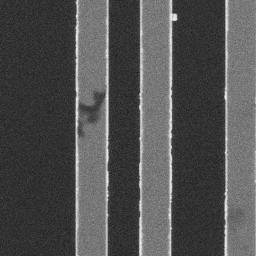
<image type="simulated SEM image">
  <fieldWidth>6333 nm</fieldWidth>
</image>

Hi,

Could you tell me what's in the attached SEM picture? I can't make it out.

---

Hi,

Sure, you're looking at lines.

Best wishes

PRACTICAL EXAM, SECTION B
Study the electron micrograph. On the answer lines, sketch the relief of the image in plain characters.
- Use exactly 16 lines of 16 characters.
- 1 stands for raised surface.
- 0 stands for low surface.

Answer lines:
0000011001100011
0000011001100011
0000011001100011
0000011001100011
0000011001100011
0000011001100011
0000011001100011
0000011001100011
0000011001100011
0000011001100011
0000011001100011
0000011001100011
0000011001100011
0000011001100011
0000011001100011
0000011001100011